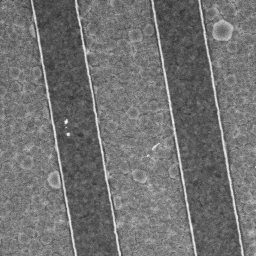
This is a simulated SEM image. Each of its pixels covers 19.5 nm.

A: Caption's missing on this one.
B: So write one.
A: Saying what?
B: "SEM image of one or a few lines or trenches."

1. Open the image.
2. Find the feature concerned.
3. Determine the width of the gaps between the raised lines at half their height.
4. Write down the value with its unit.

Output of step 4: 1.47 micrometres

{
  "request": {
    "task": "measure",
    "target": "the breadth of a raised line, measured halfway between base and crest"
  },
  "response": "879 nm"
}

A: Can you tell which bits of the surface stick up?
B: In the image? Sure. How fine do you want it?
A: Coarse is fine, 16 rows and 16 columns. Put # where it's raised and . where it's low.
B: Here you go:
..###.....###...
..###.....###...
..###.....###...
...##.....###...
...###....###...
...###....###...
...###.....###..
...###.....###..
...###.....###..
....##.....###..
....###....###..
....###....###..
....###.....###.
....###.....###.
....###.....###.
.....##.....###.